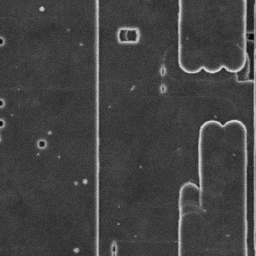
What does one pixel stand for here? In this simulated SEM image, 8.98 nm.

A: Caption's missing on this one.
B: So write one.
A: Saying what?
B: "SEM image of wiring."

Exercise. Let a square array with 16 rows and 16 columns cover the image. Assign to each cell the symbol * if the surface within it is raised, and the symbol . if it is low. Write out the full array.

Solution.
******.....****.
******.....****.
******.....****.
******.....****.
******..........
******..........
******..........
******..........
******......***.
******......***.
******......***.
******......***.
******.....****.
******.....****.
******.....****.
******.....****.